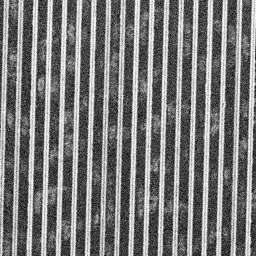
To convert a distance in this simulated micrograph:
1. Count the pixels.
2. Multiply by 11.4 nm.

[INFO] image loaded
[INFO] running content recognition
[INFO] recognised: parallel lines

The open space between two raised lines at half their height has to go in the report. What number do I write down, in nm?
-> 127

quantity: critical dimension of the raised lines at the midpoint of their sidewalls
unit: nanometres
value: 41.4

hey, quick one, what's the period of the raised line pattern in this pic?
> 166 nm